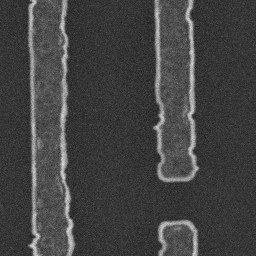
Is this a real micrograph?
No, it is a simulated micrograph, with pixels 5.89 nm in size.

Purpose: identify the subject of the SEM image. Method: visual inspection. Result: one or a few lines or trenches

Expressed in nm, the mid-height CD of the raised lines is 203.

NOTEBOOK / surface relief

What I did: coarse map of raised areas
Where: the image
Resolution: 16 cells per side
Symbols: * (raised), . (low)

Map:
..**......**....
..**......**....
..**......**....
..**......**....
..**......**....
..**......**....
..**......**....
..**......**....
..**......**....
..**......**....
..**......**....
..**............
..**............
..**............
..**......**....
..**......**....